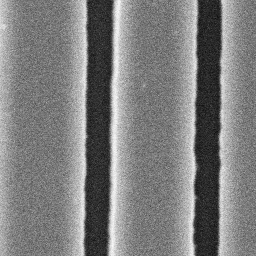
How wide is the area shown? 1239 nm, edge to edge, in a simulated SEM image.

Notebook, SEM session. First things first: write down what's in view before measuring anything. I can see lines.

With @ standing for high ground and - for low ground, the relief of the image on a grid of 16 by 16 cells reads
@@@@@--@@@@@--@@
@@@@@--@@@@@--@@
@@@@@--@@@@@--@@
@@@@@--@@@@@--@@
@@@@@--@@@@@--@@
@@@@@--@@@@@--@@
@@@@@--@@@@@--@@
@@@@@--@@@@@--@@
@@@@@--@@@@@--@@
@@@@@--@@@@@--@@
@@@@@--@@@@@--@@
@@@@@--@@@@@--@@
@@@@@--@@@@@--@@
@@@@@--@@@@@--@@
@@@@@--@@@@@--@@
@@@@@--@@@@@--@@